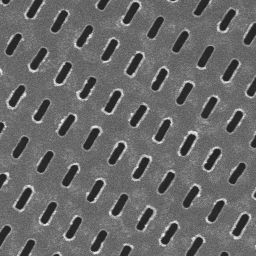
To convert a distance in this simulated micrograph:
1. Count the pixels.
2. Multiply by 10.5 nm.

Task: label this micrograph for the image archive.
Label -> a regular array of holes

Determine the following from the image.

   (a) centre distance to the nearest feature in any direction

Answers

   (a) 300 nanometres